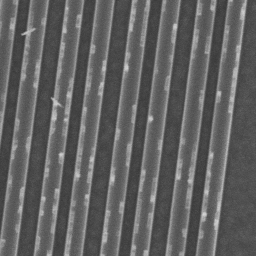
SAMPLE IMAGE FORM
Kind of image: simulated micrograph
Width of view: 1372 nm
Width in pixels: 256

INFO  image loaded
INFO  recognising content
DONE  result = parallel lines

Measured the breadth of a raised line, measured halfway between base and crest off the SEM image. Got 92.3 nm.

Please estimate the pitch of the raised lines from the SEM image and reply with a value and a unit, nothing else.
32.7 pixels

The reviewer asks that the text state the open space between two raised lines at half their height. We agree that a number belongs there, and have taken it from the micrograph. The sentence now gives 71.7 nanometers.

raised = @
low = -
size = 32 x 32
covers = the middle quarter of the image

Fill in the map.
@@@---@@@@-----@@@@----@@@@----@
@@@---@@@@-----@@@@----@@@@----@
@@@---@@@@-----@@@@----@@@-----@
@@----@@@@-----@@@@---@@@@-----@
@@----@@@@-----@@@@---@@@@-----@
@@---@@@@@-----@@@@---@@@@-----@
@@---@@@@@-----@@@----@@@@-----@
@@---@@@@-----@@@@----@@@@-----@
@@---@@@@-----@@@@----@@@@----@@
@@---@@@@-----@@@@----@@@@----@@
@@---@@@@-----@@@@----@@@-----@@
@----@@@@-----@@@@---@@@@-----@@
@----@@@@-----@@@@---@@@@-----@@
@---@@@@@----@@@@@---@@@@-----@@
@---@@@@@----@@@@----@@@@-----@@
@---@@@@-----@@@@----@@@@-----@@
@---@@@@-----@@@@----@@@@----@@@
@---@@@@-----@@@@----@@@@----@@@
@---@@@@-----@@@@----@@@-----@@@
----@@@@-----@@@@---@@@@-----@@@
----@@@@-----@@@@---@@@@-----@@@
---@@@@@----@@@@@---@@@@-----@@@
---@@@@@----@@@@----@@@@-----@@@
---@@@@-----@@@@----@@@@-----@@@
---@@@@-----@@@@----@@@@----@@@@
---@@@@-----@@@@----@@@@----@@@@
---@@@@-----@@@@----@@@-----@@@@
---@@@@-----@@@@---@@@@-----@@@@
---@@@@-----@@@@---@@@@-----@@@@
--@@@@@-----@@@@---@@@@-----@@@@
--@@@@@-----@@@----@@@@-----@@@@
--@@@@-----@@@@----@@@@-----@@@@